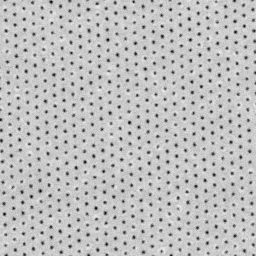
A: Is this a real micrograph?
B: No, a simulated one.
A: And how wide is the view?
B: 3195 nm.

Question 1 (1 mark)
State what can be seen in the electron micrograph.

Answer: a regular array of holes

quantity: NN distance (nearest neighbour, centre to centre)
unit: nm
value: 127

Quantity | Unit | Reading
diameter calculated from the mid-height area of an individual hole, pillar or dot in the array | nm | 42.2